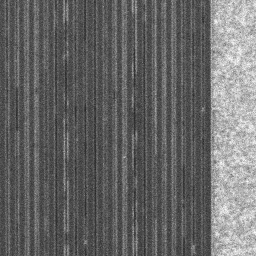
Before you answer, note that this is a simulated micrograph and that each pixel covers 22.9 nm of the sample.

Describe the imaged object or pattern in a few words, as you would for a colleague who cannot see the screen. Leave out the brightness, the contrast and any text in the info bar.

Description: parallel lines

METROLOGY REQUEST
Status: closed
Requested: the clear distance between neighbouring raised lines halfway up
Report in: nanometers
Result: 65.7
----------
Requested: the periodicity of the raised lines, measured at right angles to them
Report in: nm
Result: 224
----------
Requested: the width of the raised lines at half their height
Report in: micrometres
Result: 0.174